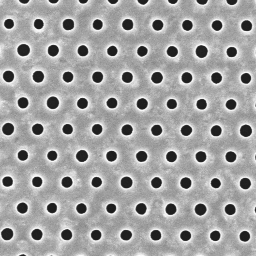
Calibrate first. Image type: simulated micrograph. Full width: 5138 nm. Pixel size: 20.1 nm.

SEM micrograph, a regular array of holes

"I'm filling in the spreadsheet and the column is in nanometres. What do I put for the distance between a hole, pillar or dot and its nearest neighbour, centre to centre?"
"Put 593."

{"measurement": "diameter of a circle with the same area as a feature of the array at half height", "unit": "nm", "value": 220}